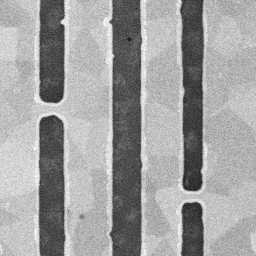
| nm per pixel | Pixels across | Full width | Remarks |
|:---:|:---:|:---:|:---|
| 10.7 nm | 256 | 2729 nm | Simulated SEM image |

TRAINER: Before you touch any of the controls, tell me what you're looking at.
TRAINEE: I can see one or a few lines or trenches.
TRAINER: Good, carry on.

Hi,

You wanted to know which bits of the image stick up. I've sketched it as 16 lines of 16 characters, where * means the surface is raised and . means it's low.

**..***..**..***
**..***..**..***
**..***..**..***
**..***..**..***
**..***..**..***
**..***..**..***
*******..**..***
***.***..**..***
**..***..**..***
**..***..**..***
**..***..**..***
**..***..**..***
**..***..*******
**..***..**..***
**..***..**..***
**..***..**..***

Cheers